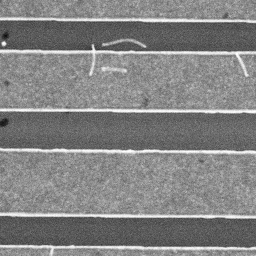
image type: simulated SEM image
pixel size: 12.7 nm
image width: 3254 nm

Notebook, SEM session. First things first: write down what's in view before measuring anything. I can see lines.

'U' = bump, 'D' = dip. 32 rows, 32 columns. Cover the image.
UUUUUUUUUUUUUUUUUUUUUUUUUUUUUUUU
UUUUUUUUUUUUUUUUUUUUUUUUUUUUUUUU
DDDDDDDDUUUUUUUUUUUUUUUUUUUUUUUU
DDDDDDDDDDDDDDDDDDDDDDDDDDDDDDDD
DDDDDDDDDDDDDDDDDDDDDDDDDDDDDDDD
DDDDDDDDDDDDDDDDDDDDDDDDDDDDDDDD
UUUUUUUUUUUUUUDDUDDDDDDDDDDDDDDD
UUUUUUUUUUUUUUUUUUUUUUUUUUUUUUUU
UUUUUUUUUUUUUUUUUUUUUUUUUUUUUUUU
UUUUUUUUUUUUUUUUUUUUUUUUUUUUUUUU
UUUUUUUUUUUUUUUUUUUUUUUUUUUUUUUU
UUUUUUUUUUUUUUUUUUUUUUUUUUUUUUUU
UUUUUUUUUUUUUUUUUUUUUUUUUUUUUUUU
UUUUUUUUUUUUUUUUUUUUUUUUUUUUUUUU
DDDDDDDDDDDDDDDDDDDDDDDDDDDDDDDD
DDDDDDDDDDDDDDDDDDDDDDDDDDDDDDDD
DDDDDDDDDDDDDDDDDDDDDDDDDDDDDDDD
DDDDDDDDDDDDDDDDDDDDDDDDDDDDDDDD
DDDDDDDDDDDDDDDDDDDDDDDDDDDDDDDD
UUUUUUUUUUUUUUUUUUUUUUUUUUUUUUUU
UUUUUUUUUUUUUUUUUUUUUUUUUUUUUUUU
UUUUUUUUUUUUUUUUUUUUUUUUUUUUUUUU
UUUUUUUUUUUUUUUUUUUUUUUUUUUUUUUU
UUUUUUUUUUUUUUUUUUUUUUUUUUUUUUUU
UUUUUUUUUUUUUUUUUUUUUUUUUUUUUUUU
UUUUUUUUUUUUUUUUUUUUUUUUUUUUUUUU
UUUUUUUUUUUUUUUUUUUUUUUUUUUUUUUU
DDDDDDDDDDDDDDDDDDDDDDDDDDDDDDDD
DDDDDDDDDDDDDDDDDDDDDDDDDDDDDDDD
DDDDDDDDDDDDDDDDDDDDDDDDDDDDDDDD
DDDDDDDDDDDDDDDDDDDDDDDDDDDDDDDD
UUUUUUUUUUUUUUUUUUUUUUUUUUUUUUUU